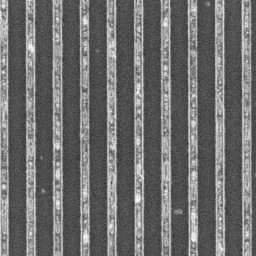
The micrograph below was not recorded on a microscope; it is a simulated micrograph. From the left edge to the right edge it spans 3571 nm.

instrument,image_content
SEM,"parallel lines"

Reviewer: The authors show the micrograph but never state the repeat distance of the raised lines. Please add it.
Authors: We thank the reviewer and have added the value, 377 nm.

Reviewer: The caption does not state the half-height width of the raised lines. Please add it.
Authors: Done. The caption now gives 117 nanometers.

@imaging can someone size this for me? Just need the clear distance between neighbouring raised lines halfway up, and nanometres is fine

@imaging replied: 263